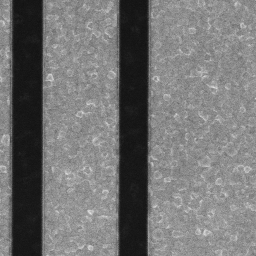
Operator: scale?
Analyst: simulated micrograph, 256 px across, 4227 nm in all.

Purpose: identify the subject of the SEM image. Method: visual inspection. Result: one or a few lines or trenches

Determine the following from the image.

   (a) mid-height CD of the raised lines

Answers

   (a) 530 nanometers